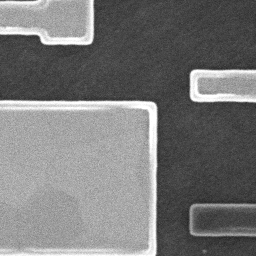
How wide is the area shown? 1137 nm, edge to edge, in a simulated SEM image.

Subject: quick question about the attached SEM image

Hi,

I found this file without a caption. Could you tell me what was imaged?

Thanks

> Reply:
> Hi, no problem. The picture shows wiring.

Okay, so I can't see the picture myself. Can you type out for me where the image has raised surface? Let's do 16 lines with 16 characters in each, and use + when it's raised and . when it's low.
++++++..........
++++++..........
...+++..........
................
............++++
............++++
+++++++++.......
++++++++++......
++++++++++......
++++++++++......
++++++++++......
++++++++++......
++++++++++......
++++++++++..++++
++++++++++..++++
++++++++++......